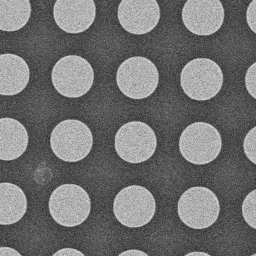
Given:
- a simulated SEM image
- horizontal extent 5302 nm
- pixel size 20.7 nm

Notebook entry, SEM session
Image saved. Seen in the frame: an array of small figures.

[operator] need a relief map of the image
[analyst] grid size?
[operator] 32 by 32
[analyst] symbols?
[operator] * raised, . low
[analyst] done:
****...*****...*****...*****...*
****...*****...*****...*****...*
***....*****...*****...*****...*
***.....***....****....****....*
................................
................................
................................
***....****.....***.....**......
***....****....****....****....*
****..******...*****...*****...*
***....*****...*****...*****...*
**.....****....****....****....*
................................
................................
................................
***....***......**......**......
***....****....****....****....*
***...******..******..******...*
***...*****...*****...******..**
**.....****....****....****....*
................................
................................
................................
**.....***......**......**......
***...*****....****....****....*
***...*****...*****...*****...**
***...*****...*****...*****...**
**.....****....****....****....*
........................**......
................................
................................
**.....***......**..............